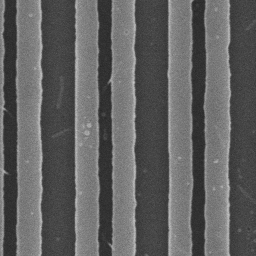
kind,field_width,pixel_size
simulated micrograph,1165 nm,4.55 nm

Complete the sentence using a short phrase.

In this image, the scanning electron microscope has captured lines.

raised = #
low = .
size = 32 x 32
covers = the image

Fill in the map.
#.###....###..###....###..###...
#.###....###..###....###..###...
..###....###..###....###..###...
..###....###..###....###..###...
..###.....##..###....###..###...
..###.....##..###....###..###...
#.###....###..###....###..##....
..###.....##..###....###..###...
..###....###..###....###..###...
..###....###..###....###..###...
..###....###..###....###..###...
..###....###..###....###..###...
#.###....###..###....###..###...
..###....###..###....###.####...
..###....###..###....###..###...
..###....###..###....###..###...
..###....###..###....###..###...
..###....###..###....###..###...
..###....###..###....###..###...
..###....###..###....###..###...
..###....###..###....###..##....
#.###....###..###....###..##....
..###....###..###....###..###...
..###.....##..###....###..###...
..###.....##..###....###..###...
..###....###..###....###..###...
..###....###..###....###..###...
..###....###..###....###..###...
..###....###..###....###..###...
..###.....##..###....###..###...
..###....###..###....###..###...
..###....###..###....###..###...